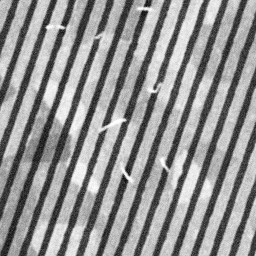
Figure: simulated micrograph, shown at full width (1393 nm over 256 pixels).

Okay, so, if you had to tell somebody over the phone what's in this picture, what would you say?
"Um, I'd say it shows parallel lines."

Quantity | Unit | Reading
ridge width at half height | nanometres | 52.1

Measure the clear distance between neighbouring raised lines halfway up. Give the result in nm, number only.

46.2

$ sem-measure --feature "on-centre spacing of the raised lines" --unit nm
97.9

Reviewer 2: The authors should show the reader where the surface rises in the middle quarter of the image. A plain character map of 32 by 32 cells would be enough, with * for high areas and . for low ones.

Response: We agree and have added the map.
..***..***..**...**..***..***..*
..***..**..***..***..***..**...*
..**..***..***..**...**..***..**
.***..***..**...**...**..***..**
.***..**..***..***..***..**...**
.**..***..***..**...**...**..***
***..***..***..**..***..***..**.
**...**..***..***..**...**...**.
**..***..***..**...**..***..***.
**..***..**..***..***..***..**..
*...**..***..***..***..**...**..
*..***..***..**...**..***..***..
*..***..**..***..***..***..**...
*..**..***..***..***..**..***..*
..***..***..**...**..***..***..*
..***..**..***..***..**...**...*
.***..***..***..**...**..***..**
.***..**...**...**..***..***..**
.**...**..***..***..**...**...**
***..***..***..**...**..***..***
***..***..**..***..***..***..**.
***..**..***..***..**...**..***.
**..***..**...**...**..***..***.
**..**...**..***..***..**...**..
*...**..***..***..**...**..***..
*..***..***..**...**..***..***..
*..**...**..***..***..**..***...
..***..***..***..**...**..***..*
..***..**...**..***..***..***..*
..**...**...**..***..***..**..**
.***..***..***..**...**..***..**
.***..**...**..***..***..***..**